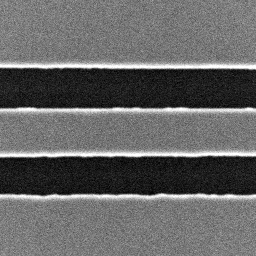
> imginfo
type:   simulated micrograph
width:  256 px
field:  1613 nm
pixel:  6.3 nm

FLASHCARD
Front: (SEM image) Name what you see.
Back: lines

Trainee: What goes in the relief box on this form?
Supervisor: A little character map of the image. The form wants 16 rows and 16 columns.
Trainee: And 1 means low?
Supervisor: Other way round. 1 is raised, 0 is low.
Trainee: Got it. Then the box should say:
1111111111111111
1111111111111111
1111111111111111
1111111111111111
0000000000000000
0000000000000000
0000000000000000
1111111111111111
1111111111111111
1111111111111111
0000000000000000
0000000000000000
1111111111111111
1111111111111111
1111111111111111
1111111111111111